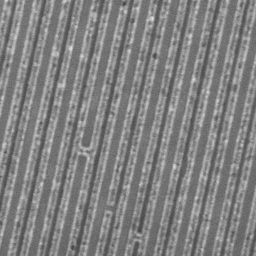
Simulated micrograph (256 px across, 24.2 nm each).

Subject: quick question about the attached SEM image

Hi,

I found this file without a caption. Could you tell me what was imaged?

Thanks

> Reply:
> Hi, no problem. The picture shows parallel lines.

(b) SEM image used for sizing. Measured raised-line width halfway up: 0.144 um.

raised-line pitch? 343 nanometers